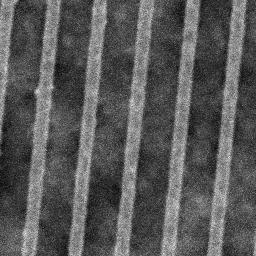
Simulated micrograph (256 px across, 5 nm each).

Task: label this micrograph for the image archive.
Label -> parallel lines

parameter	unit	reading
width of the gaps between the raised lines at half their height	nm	171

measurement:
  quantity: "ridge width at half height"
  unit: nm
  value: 59.7